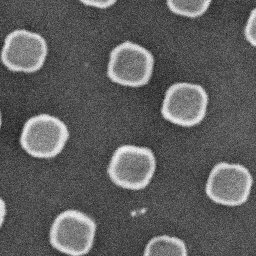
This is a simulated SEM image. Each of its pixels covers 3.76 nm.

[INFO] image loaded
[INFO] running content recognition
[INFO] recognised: raised bodies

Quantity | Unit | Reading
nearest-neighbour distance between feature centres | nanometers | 320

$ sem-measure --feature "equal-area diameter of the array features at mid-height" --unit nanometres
159